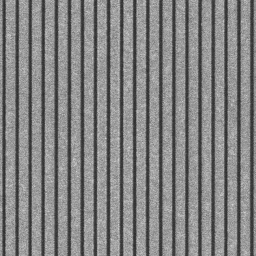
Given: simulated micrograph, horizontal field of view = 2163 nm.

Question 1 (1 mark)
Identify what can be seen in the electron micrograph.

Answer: parallel lines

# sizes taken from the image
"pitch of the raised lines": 110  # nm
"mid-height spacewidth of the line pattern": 31.7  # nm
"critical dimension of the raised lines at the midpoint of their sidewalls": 79.2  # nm